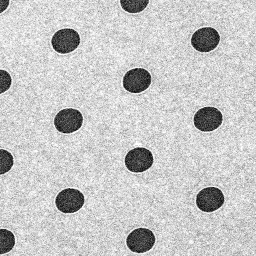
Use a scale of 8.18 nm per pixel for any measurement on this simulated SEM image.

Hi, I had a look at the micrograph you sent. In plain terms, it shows a regular array of holes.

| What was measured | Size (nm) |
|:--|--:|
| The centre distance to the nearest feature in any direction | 650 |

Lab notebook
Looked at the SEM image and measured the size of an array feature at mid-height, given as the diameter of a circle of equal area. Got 226 nm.